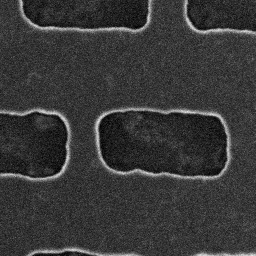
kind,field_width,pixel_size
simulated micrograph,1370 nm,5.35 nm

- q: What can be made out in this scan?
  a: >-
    holes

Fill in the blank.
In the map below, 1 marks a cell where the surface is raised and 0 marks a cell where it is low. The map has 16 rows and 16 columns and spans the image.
1000000001110000
1100000001110000
1111111111111111
1111111111111111
1111111111111111
1111111111111111
1111111111111111
0000110000000011
0000110000000011
0000110000000011
0000111000000011
1111111111111111
1111111111111111
1111111111111111
1111111111111111
1111111111111111